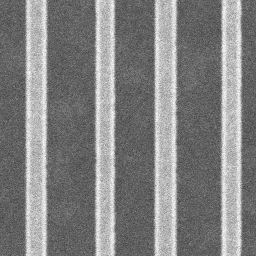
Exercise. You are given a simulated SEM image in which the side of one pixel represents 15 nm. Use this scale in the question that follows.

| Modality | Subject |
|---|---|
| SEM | one or a few lines or trenches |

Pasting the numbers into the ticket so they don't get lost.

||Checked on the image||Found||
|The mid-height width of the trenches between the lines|733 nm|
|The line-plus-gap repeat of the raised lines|65.1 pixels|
